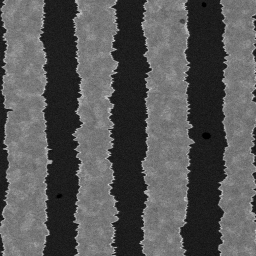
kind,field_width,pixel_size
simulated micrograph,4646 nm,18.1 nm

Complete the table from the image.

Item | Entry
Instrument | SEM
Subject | one or a few lines or trenches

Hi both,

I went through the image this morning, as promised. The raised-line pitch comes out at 1280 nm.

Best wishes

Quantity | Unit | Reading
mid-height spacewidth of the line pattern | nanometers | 615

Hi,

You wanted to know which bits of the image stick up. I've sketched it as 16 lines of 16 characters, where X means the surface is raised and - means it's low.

XXX--XX--XXX--XX
XXX--XX--XXX--XX
XXX--XX--XXX--XX
XXX--XX--XXX--XX
XXX--XX--XXX--XX
XXX--XX--XXX--XX
XXX--XX--XXX--XX
XXX--XX--XXX--XX
XXX--XX--XXX--XX
XXX--XX--XXX--XX
XXX--XX--XXX--XX
-XX--XX--XXX--XX
XXX--XX--XXX--XX
XXX--XX--XXX--XX
XXX--XX--XX---XX
XXX--XX--XX---XX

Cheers